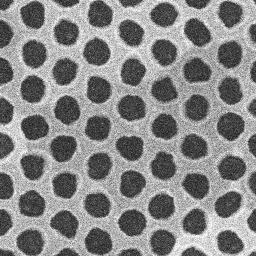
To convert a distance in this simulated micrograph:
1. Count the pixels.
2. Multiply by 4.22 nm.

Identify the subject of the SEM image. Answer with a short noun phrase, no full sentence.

a regular array of holes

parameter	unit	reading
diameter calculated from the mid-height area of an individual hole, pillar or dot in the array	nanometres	119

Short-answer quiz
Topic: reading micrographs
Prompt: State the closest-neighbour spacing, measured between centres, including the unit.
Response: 0.151 µm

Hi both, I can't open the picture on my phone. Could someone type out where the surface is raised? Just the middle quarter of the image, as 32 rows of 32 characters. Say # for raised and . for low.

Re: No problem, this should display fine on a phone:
....####.#####......####..####..
....##########.......########...
....##########......##########..
...###.....###......####...###..
..####......###....###.....####.
######......#####.####......####
######......##########......####
#####.......#########.......####
...###.....###.....###.......##.
....###...###.......###.....##..
....#########........#########..
....#########........#########..
....##########.......###..####..
....##.....####.....###....###..
...###......##########......####
#.###.......##########.......###
#####.......##########.......###
#####......###########.......#..
...###.....###.....#####...##...
...#####.####.......#########...
...##########.......#########...
...##########.......#########...
...####....###......###....##...
..####......###....####.....##..
.#####......##########......####
######......#########.......####
######......####.#####......####
...###.....####....###......###.
....##.....###......###....###..
....####.#####.......########...
...###########.......########...
...###########......##########..